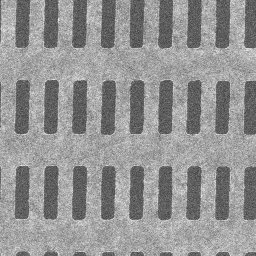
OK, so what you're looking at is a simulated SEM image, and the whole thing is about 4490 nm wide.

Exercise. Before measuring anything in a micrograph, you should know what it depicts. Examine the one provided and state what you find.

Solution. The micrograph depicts a regular array of holes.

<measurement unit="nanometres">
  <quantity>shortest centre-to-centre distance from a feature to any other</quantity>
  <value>500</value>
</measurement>